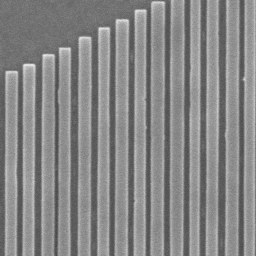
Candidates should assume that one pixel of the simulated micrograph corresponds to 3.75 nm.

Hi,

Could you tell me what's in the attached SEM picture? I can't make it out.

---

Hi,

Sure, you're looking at parallel lines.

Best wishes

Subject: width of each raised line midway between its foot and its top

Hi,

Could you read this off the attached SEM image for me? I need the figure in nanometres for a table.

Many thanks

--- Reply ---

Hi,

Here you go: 44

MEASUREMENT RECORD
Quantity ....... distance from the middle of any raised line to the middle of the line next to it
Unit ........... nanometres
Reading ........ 68.7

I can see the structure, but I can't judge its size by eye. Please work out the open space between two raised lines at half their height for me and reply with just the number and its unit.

25.8 nm